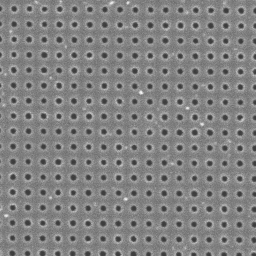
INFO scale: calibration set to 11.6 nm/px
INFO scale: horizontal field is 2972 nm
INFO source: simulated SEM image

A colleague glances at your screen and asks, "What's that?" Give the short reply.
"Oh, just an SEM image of a regular array of holes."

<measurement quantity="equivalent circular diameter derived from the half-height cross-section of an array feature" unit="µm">0.0681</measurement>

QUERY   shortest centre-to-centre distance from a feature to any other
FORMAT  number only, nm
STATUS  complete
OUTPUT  172